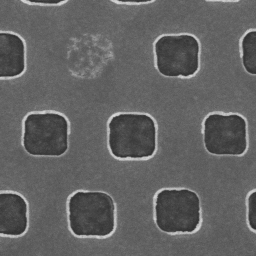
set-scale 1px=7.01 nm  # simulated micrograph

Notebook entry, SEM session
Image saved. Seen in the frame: holes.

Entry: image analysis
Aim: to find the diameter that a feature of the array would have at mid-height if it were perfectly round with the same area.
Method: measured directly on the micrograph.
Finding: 316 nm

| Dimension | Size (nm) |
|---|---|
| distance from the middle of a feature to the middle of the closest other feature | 604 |